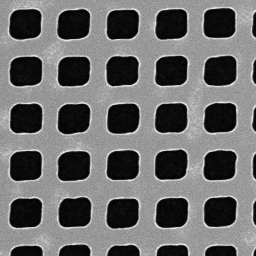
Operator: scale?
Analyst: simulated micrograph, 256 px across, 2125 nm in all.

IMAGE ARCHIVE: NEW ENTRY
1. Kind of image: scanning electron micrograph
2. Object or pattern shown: a regular array of holes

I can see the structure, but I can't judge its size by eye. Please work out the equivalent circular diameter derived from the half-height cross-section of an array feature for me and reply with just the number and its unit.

276 nm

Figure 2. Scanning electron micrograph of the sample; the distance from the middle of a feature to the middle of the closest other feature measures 389 nm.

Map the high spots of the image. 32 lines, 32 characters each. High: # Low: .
################################
##...###...###...###...###...###
#....##....##....###...##.....##
#....##....##....###...##.....##
#....##....###...###...###...###
################################
################################
##...###...###...###...###...###
#....##....##....##.....##....##
#....##....##....##....###....##
##...###...###...###...###...###
################################
################################
##...###...###...###...###...###
#....##....##.....#....###....##
#....##....##....##....###....##
##...###..####...###...###..####
################################
################################
##...###...###...###...###...###
#....##....##....##....##....###
#....##....##....##....##....###
##..####..####.#####..####..####
################################
################################
#....###...###...###...###....##
#....##....##....##.....#....###
#....##....##....##....###...###
##############.#################
################################
################################
#....##....###...###...###....##